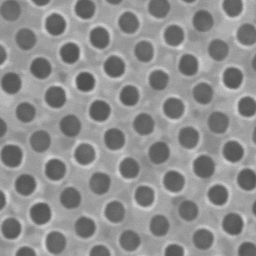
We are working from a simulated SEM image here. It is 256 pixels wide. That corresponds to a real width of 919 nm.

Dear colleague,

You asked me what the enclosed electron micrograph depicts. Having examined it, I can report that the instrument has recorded a regular array of holes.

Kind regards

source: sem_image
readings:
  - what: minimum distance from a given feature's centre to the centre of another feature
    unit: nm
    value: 116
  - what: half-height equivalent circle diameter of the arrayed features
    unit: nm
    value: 81.2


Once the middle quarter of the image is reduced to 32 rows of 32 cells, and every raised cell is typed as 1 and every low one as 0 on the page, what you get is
11111111110000011111111111110000
11111111110000011111111011111000
11110001111000011111100000111100
11100000111101111111100000111111
11100000111111111111100000111111
11100000111111100011110000111111
11110001111111000001111001111111
11111111111111000001111111111111
01111111111111000001111111000111
01111110001111000001111110000011
11111100000011100011111100000011
11111100000011111111111110000011
10111100000011111100011110000011
00001110000111111000001111000111
00001111011111111000000111111111
00001111111111111000000111111100
00001111111000111000000111111000
00001111110000011100001111110000
11111111110000011111111111110000
11111111110000011111110001110000
11100001110000011111100000111000
11100000111001111111100000011110
11000000111111111111100000011111
11000000111111100111100000111111
11100001111111000011110001111111
01111111111111000001111111111111
01111111111111000001111111101111
11111110000111000001111110000111
11111100000011100111111110000011
11111100000011111111111110000011
10111100000011111110011110000011
00001100000111111100001111000111